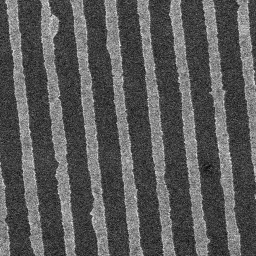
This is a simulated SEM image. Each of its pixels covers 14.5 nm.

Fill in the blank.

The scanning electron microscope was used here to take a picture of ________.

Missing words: parallel lines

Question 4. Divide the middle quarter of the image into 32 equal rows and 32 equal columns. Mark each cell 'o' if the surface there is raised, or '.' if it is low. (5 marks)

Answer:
....oo......oo......ooo.....ooo.
....oo......ooo......o.......oo.
....ooo.....oo.......oo......oo.
....ooo......oo.....ooo......oo.
....ooo.....ooo......oo......oo.
....ooo.....oo.......oo......oo.
....ooo......oo......oo......oo.
....ooo......oo......oo.......o.
.....oo......oo......ooo......oo
.....oo......oo......ooo......oo
.....oo......oo......ooo......oo
.....oo......oo......ooo......oo
.....ooo.....ooo.....ooo......oo
.....ooo.....oo......ooo......oo
.....ooo.....ooo......oo......oo
.....ooo......oo......oo......oo
.....ooo......oo......oo......oo
......oo......oo......ooo.....oo
......oo......oo......oo......oo
......oo......oo......ooo.....oo
......oo......ooo.....ooo.....oo
......oo......oo......ooo......o
......oo......ooo.....ooo......o
......oo......ooo.....ooo......o
o.....oo......ooo......oo......o
o.....ooo......oo......oo......o
o.....ooo......oo......oo......o
o......oo......oo......oo......o
o......oo......oo......oo......o
o......oo......ooo.....oo......o
o......oo......ooo.....oo.......
o......oo......ooo.....ooo.....o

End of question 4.